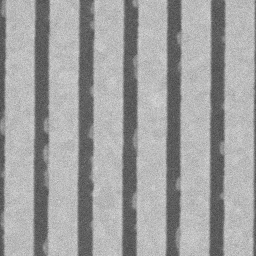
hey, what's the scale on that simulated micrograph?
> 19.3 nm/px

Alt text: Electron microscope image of lines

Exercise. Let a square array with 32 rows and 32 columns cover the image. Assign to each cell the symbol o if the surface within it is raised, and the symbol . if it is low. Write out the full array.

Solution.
.ooo..oooo..ooo..oooo..ooo..oooo
.ooo..oooo..ooo..oooo..ooo..oooo
.ooo..oooo..ooo..oooo..ooo..oooo
.ooo..oooo..ooo..oooo..ooo..oooo
.ooo..oooo..ooo..oooo..ooo..oooo
.ooo..oooo..ooo..oooo..ooo..oooo
.ooo..oooo..ooo..oooo..ooo..oooo
.ooo..oooo..ooo..oooo..ooo..oooo
.ooo..oooo..ooo..oooo..ooo..oooo
.ooo..oooo..ooo..oooo..ooo..oooo
.ooo..oooo..ooo..oooo..ooo..oooo
.ooo..oooo..ooo..oooo..ooo..oooo
.ooo..oooo..ooo..oooo..ooo..oooo
.ooo..oooo..ooo..oooo..ooo..oooo
.ooo..oooo..ooo..oooo..ooo..oooo
.ooo..oooo..ooo..oooo..ooo..oooo
.ooo..oooo..ooo..oooo..ooo..oooo
.ooo..oooo..ooo..oooo..ooo..oooo
.ooo..oooo..ooo..oooo..ooo..oooo
.ooo..oooo..ooo..oooo..ooo..oooo
.ooo..oooo..ooo..oooo..ooo..oooo
.ooo..oooo..ooo..oooo..ooo..oooo
.ooo..oooo..ooo..oooo..ooo..oooo
.ooo..oooo..ooo..oooo..ooo..oooo
.ooo..oooo..ooo..oooo..ooo..oooo
.ooo..oooo..ooo..oooo..ooo..oooo
.ooo..oooo..ooo..oooo..ooo..oooo
.ooo..oooo..ooo..oooo..ooo..oooo
.ooo..oooo..ooo..oooo..ooo..oooo
.ooo..oooo..ooo..oooo..ooo..oooo
.ooo..oooo..ooo..oooo..ooo..oooo
.ooo..oooo..ooo..oooo..ooo..oooo